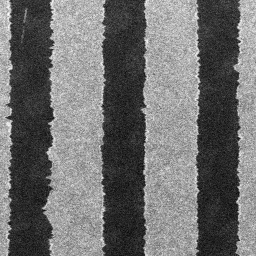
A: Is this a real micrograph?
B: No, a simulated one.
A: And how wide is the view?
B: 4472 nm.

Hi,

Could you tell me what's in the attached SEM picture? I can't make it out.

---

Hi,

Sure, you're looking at one or a few lines or trenches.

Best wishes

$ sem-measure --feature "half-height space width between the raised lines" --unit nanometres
730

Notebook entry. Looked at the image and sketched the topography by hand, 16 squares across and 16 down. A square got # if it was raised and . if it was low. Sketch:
#..####..###...#
#..#####.###...#
#..###...###...#
#..###...###...#
#..###...###...#
#..###...###...#
#..###...###...#
#..###...###...#
#..###...###...#
#..###...###...#
#..###...###...#
#..###...###...#
#..###...###...#
#..###...###...#
#..###...###...#
#..###...###...#